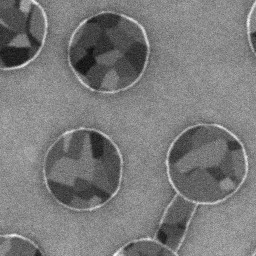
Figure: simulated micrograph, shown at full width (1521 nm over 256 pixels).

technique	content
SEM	raised bodies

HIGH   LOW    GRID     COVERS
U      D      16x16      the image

UUUDDDDDDDDDDDDD
UUUDDUUUUDDDDDDD
UUUDUUUUUDDDDDDD
UUDDUUUUUDDDDDDD
DDDDDUUUUDDDDDDD
DDDDDDUUDDDDDDDD
DDDDDDDDDDDDDDDD
DDDDDDDDDDDDDDDD
DDDDUUUDDDDUUUUD
DDDUUUUDDDDUUUUD
DDDUUUUUDDUUUUUD
DDDUUUUDDDDUUUUD
DDDDUUUDDDDUUUDD
DDDDDDDDDDUUDDDD
DDDDDDDDDDUUDDDD
UUDDDDDDUUUDDDDD